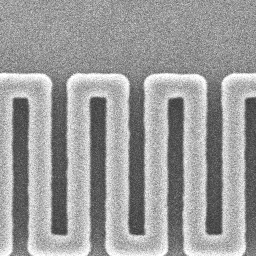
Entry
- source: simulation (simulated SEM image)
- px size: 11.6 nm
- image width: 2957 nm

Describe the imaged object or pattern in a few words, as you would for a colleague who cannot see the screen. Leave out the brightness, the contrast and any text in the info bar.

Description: groups of lines, slits or small figures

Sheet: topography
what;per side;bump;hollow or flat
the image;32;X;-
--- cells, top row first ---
--------------------------------
--------------------------------
--------------------------------
--------------------------------
--------------------------------
--------------------------------
--------------------------------
--------------------------------
--------------------------------
XXXXXX---XXXXXX----XXXXXX----XXX
XXXXXX---XXXXXXX--XXXXXXXX--XXXX
XXXXXX---XXXXXXX--XXXXXXXX--XXXX
XX-XXX---XX--XXX--XXX--XXX--XXX-
XX--XX---XX--XXX--XXX--XXX--XXX-
XX--XX---XX--XXX--XXX--XXX--XXX-
XX--XX---XX--XXX--XXX--XXX--XXX-
XX--XX--XXX--XXX--XXX--XXX--XXX-
XX--XX--XXX--XXX--XXX--XXX--XXX-
XX--XX--XXX--XXX--XXX--XXX--XXX-
XX--XX--XXX--XXX--XXX--XXX--XXX-
XX--XX---XX--XXX--XXX--XXX--XXX-
XX--XX--XXX--XXX--XXX--XXX--XXX-
XX--XX--XXX--XXX--XXX--XXX--XXX-
XX--XX---XX--XXX--XXX--XXX--XXX-
XX--XX---XX--XXX--XXX--XXX--XXX-
X---XX--XXX--XXX--XXX--XXX--XXX-
X---XX--XXX--XXX--XXX--XXX--XXX-
XX--XX---XX--XXX--XXX--XXX--XXX-
XX--XX---XX--XXX--XXX--XXX--XXX-
X---XXXXXXX--XXXXXXXX--XXXXXXXX-
X---XXXXXXX--XXXXXXXX--XXXXXXXX-
X---XXXXXXX---XXXXXXX--XXXXXXX--